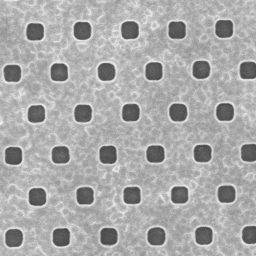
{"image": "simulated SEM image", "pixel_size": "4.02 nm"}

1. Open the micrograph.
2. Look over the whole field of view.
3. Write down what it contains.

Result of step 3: a regular array of holes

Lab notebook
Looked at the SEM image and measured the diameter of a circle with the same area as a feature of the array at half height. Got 0.0809 µm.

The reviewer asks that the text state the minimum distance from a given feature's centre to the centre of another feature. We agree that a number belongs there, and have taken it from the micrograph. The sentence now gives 188 nanometres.